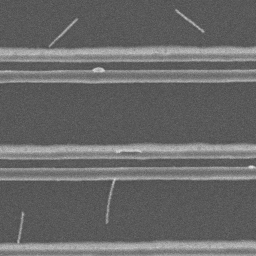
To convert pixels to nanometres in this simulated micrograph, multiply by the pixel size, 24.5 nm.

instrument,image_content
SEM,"lines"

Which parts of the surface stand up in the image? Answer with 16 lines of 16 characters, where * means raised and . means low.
................
................
................
****************
****************
................
................
................
................
****************
****************
................
................
................
................
..**************